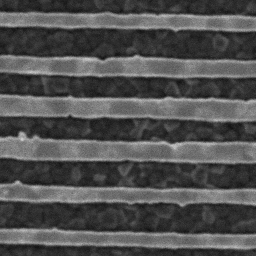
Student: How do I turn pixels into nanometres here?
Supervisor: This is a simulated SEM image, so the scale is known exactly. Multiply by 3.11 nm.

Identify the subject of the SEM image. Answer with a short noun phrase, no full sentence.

parallel lines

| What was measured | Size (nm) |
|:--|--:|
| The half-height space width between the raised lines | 85.9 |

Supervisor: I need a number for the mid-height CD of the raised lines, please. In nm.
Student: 49.4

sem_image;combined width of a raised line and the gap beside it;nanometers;135